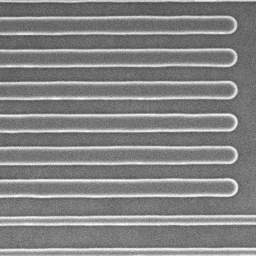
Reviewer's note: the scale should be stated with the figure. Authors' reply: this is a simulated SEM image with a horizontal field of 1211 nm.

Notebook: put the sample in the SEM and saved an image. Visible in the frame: groups of lines, slits or small figures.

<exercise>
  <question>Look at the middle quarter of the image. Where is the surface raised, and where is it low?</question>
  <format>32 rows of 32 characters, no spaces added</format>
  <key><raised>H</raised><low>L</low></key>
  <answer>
HHHHHHHHHHHLLLLLLHHHHHHHLLLLLLLL
LLLLLLLLLLLLLLLLLLLLLLLLLLLLLLLL
LLLLLLLLLLLLLLLLLLLLLLLLLLLLLLLL
LLLLLLLLLLLLLLLLLLLLLLLLLLLLLLLL
LLLLLLLLLLLLLLLLLLLLLLLLLLLLLLLL
HHHHHHHHHHHHHHHHHHHHHHHHHHHHHHHH
HHHHHHHHHHHHHHHHHHHHHHHHHHHHHHHH
HHHHHHHHHHHHHHHHHHHHHHHHHHHHHHHH
HHHHHHHHHHHHHHHHHHHHHHHHHHHHLLLL
LLLLLLLLLLLLLLLLLLLLLLLLLLLLLLLL
LLLLLLLLLLLLLLLLLLLLLLLLLLLLLLLL
LLLLLLLLLLLLLLLLLLLLLLLLLLLLLLLL
LLLLLLLLLLLLLLLLLLLLLLLLLLLLLLLL
HHHHHHHHHHHHHHHHHHHHHHHHHHHHHHHH
HHHHHHHHHHHHHHHHHHHHHHHHHHHHHHHH
HHHHHHHHHHHHHHHHHHHHHHHHHHHHHHHH
HHHHHHHHHHHHHHHHHHHHHHHHHHHHHHHH
LLLLLLLLLLLLLLLLLLLLLLLLLLLLLLLL
LLLLLLLLLLLLLLLLLLLLLLLLLLLLLLLL
LLLLLLLLLLLLLLLLLLLLLLLLLLLLLLLL
LLLLLLLLLLLLLLLLLLLLLLLLLLLLLLLL
HHHHHHHHHHHHHHHHHHHHHHHHHHHHHHHH
HHHHHHHHHHHHHHHHHHHHHHHHHHHHHHHH
HHHHHHHHHHHHHHHHHHHHHHHHHHHHHHHH
HHHHHHHHHHHHHHHHHHHHHHHHHHHHHHHH
LLLLLLLLLLLLLLLLLLLLLLLLLLLLLLLL
LLLLLLLLLLLLLLLLLLLLLLLLLLLLLLLL
LLLLLLLLLLLLLLLLLLLLLLLLLLLLLLLL
LLLLLLLLLLLLLLLLLLLLLLLLLLLLLLLL
HHHHHHHHHHHHHHHHHHHHHHHHHHHHHHHH
HHHHHHHHHHHHHHHHHHHHHHHHHHHHHHHH
HHHHHHHHHHHHHHHHHHHHHHHHHHHHHHHH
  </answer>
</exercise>